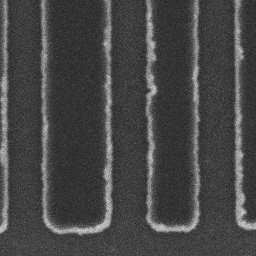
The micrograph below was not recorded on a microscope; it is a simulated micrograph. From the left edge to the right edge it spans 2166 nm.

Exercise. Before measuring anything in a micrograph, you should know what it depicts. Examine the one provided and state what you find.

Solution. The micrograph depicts one or a few lines or trenches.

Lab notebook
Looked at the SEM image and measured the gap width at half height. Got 0.328 micrometres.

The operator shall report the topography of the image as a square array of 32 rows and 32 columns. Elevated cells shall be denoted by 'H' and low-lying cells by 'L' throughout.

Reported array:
HLLLLHHHHHHHHHLLLLHHHHHHHLLLLLHH
HLLLLHHHHHHHHHLLLLLHHHHHHLLLLHHH
HLLLLHHHHHHHHHLLLLLHHHHHHLLLLHHH
HLLLLHHHHHHHHHLLLLLHHHHHHLLLLLHH
HLLLLHHHHHHHHHLLLLLHHHHHLLLLLLHH
HLLLLHHHHHHHHHLLLLLHHHHHHLLLLLHH
HLLLLHHHHHHHHHLLLLLHHHHHHLLLLLHH
HLLLLHHHHHHHHHLLLLLHHHHHHLLLLLHH
HLLLLHHHHHHHHHLLLLLHHHHHHLLLLLHH
HLLLLHHHHHHHHHLLLLLHHHHHHLLLLLHH
HLLLLLHHHHHHHHLLLLLHHHHHHLLLLLHH
HLLLLHHHHHHHHHLLLLLHHHHHHLLLLLHH
HLLLLHHHHHHHHHLLLLHHHHHHHLLLLLHH
HLLLLHHHHHHHHHLLLLHHHHHHHLLLLLHH
HLLLLHHHHHHHHHLLLLLHHHHHHLLLLLHH
HLLLLLHHHHHHHHLLLLLHHHHHHLLLLLHH
HLLLLLHHHHHHHHLLLLLHHHHHHLLLLLHH
HLLLLLHHHHHHHHLLLLLHHHHHLLLLLLHH
HLLLLLHHHHHHHHLLLLLHHHHHHLLLLLHH
HLLLLLHHHHHHHHLLLLLHHHHHHLLLLLHH
HLLLLHHHHHHHHHLLLLLHHHHHHLLLLLHH
HLLLLLHHHHHHHHLLLLLHHHHHHLLLLLHH
HLLLLLHHHHHHHHLLLLLHHHHHHLLLLLHH
HLLLLLHHHHHHHHLLLLLHHHHHHLLLLLHH
HLLLLHHHHHHHHHLLLLLHHHHHHLLLLLHH
HLLLLHHHHHHHHHLLLLLHHHHHHLLLLLHH
HLLLLLHHHHHHHHLLLLLHHHHHHLLLLLHH
HLLLLLHHHHHHHHLLLLLHHHHHHLLLLLHH
HLLLLLHHHHHHHLLLLLLHHHHHLLLLLLLL
LLLLLLLLLLLLLLLLLLLLLLLLLLLLLLLL
LLLLLLLLLLLLLLLLLLLLLLLLLLLLLLLL
LLLLLLLLLLLLLLLLLLLLLLLLLLLLLLLL